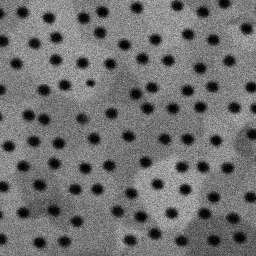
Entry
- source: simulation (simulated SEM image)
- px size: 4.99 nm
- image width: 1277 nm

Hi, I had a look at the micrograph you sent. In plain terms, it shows a regular array of holes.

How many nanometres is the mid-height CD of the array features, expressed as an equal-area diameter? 60.9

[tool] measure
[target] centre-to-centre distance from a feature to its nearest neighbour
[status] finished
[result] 113 nm